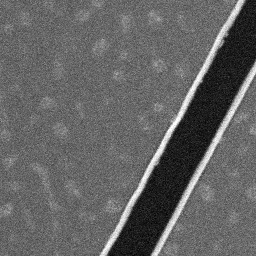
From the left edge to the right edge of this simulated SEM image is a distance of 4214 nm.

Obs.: one or a few lines or trenches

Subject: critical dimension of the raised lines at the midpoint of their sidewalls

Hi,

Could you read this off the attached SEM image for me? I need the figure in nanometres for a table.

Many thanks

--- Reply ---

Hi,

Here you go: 741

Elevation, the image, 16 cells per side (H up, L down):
LLLLLLLLLLLLLLLH
LLLLLLLLLLLLLLHH
LLLLLLLLLLLLLLHH
LLLLLLLLLLLLLHHH
LLLLLLLLLLLLLHHH
LLLLLLLLLLLLHHHL
LLLLLLLLLLLLHHHL
LLLLLLLLLLLHHHLL
LLLLLLLLLLHHHHLL
LLLLLLLLLLHHHLLL
LLLLLLLLLHHHHLLL
LLLLLLLLLHHHLLLL
LLLLLLLLHHHHLLLL
LLLLLLLLHHHLLLLL
LLLLLLLHHHLLLLLL
LLLLLLLHHHLLLLLL